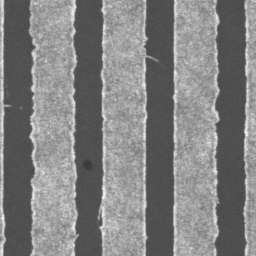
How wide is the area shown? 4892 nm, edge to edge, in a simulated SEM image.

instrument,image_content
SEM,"one or a few lines or trenches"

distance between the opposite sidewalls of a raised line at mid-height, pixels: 41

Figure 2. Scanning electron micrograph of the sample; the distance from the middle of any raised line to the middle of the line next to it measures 1360 nanometers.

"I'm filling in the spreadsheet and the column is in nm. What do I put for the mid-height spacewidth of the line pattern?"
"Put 583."